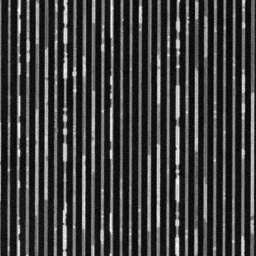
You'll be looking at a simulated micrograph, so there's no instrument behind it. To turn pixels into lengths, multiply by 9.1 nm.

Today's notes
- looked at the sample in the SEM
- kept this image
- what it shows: parallel lines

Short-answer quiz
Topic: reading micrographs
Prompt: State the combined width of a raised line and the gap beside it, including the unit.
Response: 0.0853 micrometres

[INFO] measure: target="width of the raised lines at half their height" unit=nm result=17.1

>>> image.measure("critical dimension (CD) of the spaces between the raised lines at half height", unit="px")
7.37